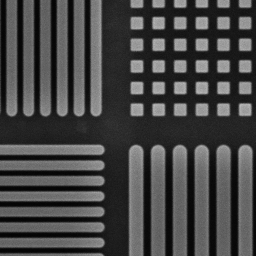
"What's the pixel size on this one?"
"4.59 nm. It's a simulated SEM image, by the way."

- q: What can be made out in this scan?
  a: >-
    groups of lines, slits or small figures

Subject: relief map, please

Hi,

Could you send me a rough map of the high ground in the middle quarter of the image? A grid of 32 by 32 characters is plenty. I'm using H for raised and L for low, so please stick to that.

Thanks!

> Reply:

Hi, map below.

HLHHHLLHHLLLLLLLLHHHLLHHHLLLHHLL
HLHHHLLHHLLLLLLLLHHHLLHHHLLLHHLL
HLHHHLLHHLLLLLLLLLLLLLLLLLLLLLLL
HLHHHLLHHLLLLLLLLLLLLLLLLLLLLLLL
HLHHHLLHHLLLLLLLLLLLLLLLLLLLLLLL
HLHHHLLHHLLLLLLLLHHHLLHHHLLLHHLL
HLHHHLLHHLLLLLLLLHHHLLHHHLLLHHLL
HLHHHLLHHLLLLLLLLLLLLLLLLLLLLLLL
HLHHHLLHHLLLLLLLLLLLLLLLLLLLLLLL
HLHHHLLHHLLLLLLLLLLLLLLLLLLLLLLL
HLHHHLLHHLLLLLLLLHHHLLHHHLLLHHLL
HLHHHLLHHLLLLLLLLHHHLLHHHLLLHHLL
HLLHHLLHHLLLLLLLLHHHLLHHHLLLHHLL
LLLLLLLLLLLLLLLLLLLLLLLLLLLLLLLL
LLLLLLLLLLLLLLLLLLLLLLLLLLLLLLLL
LLLLLLLLLLLLLLLLLLLLLLLLLLLLLLLL
LLLLLLLLLLLLLLLLLLLLLLLLLLLLLLLL
LLLLLLLLLLLLLLLLLLLLLLLLLLLLLLLL
LLLLLLLLLLLLLLLLLLLLLLLLLLLLLLLL
LLLLLLLLLLLLLLLLLLLLLLLLLLLLLLLL
HHHHHHHHHLLLLLLLLHHLLLLHLLLLHHLL
HHHHHHHHHHLLLLLLHHHHLLHHHLLHHHHL
HHHHHHHHHLLLLLLLHHHHLLHHHLLHHHHL
LLLLLLLLLLLLLLLLHHHHLLHHHLLHHHHL
HHHHHHHHHHLLLLLLHHHHLLHHHLLHHHHL
HHHHHHHHHHLLLLLLHHHHLLHHHLLHHHHL
LLLLLLLLLLLLLLLLHHHHLLHHHLLHHHHL
LLLLLLLLLLLLLLLLHHHHLLHHHLLHHHHL
HHHHHHHHHHLLLLLLHHHHLLHHHLLHHHHL
HHHHHHHHHHLLLLLLHHHHLLHHHLLHHHHL
LLLLLLLLLLLLLLLLHHHHLLHHHLLHHHHL
LLLLLLLLLLLLLLLLHHHHLLHHHLLHHHHL